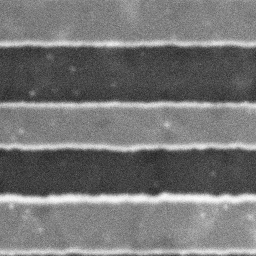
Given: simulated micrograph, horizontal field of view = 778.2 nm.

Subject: lines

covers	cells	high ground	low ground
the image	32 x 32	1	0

11111111111111111111111111111111
11111111111111111111111111111111
11111111111111111111111111111111
11111111111111111111111111111111
11111111111111111111111111111111
11101111111111111111001111110111
00000000000000000000000000000000
00000000000000000000000000000000
00000000000000000000000000000000
00000000000000000000000000000000
00000000000000000000000000000000
00000000000000000000000000000000
00000000000000000000000000000000
11111111111111111111111111111111
11111111111111111111111111111111
11111111111111111111111111111111
11111111111111111111111111111111
11111111111111111111111111111111
00111000000001111110010000000001
00000000000000000000000000000000
00000000000000000000000000000000
00000000000000000000000000000000
00000000000000000000000000000000
00000000000000000000000000000000
00000000000000000000000000000000
11111111111111111111111111111111
11111111111111111111111111111111
11111111111111111111111111111111
11111111111111111111111111111111
11111111111111111111111111111111
11111111111111111111111111111111
11111111111111111111111111111111